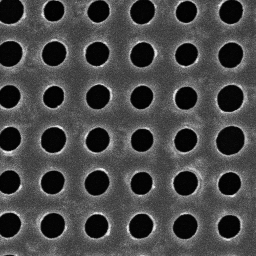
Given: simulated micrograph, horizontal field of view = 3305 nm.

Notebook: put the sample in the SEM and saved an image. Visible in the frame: a regular array of holes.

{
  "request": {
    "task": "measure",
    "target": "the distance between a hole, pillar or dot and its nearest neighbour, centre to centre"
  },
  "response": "552 nanometers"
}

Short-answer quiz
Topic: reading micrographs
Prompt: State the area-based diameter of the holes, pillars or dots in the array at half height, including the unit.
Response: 312 nm